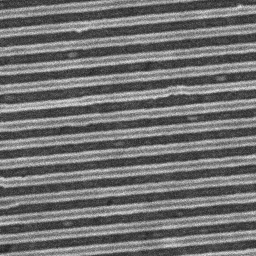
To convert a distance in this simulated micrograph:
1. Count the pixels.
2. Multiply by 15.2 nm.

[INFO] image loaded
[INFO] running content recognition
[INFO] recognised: parallel lines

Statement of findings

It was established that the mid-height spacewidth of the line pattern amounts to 178 nanometers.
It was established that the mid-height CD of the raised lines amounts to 104 nanometers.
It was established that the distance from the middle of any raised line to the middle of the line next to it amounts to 0.284 micrometres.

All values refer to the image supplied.